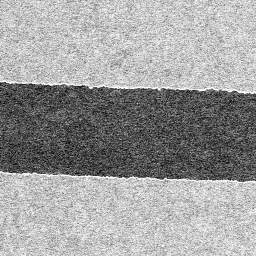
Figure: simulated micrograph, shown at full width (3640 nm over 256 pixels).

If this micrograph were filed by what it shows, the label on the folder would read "one or a few lines or trenches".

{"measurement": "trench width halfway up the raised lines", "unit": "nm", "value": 1280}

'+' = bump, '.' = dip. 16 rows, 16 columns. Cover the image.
++++++++++++++++
++++++++++++++++
++++++++++++++++
++++++++++++++++
++++++++++++++++
.......+++++++++
................
................
................
................
................
++++++++++++++++
++++++++++++++++
++++++++++++++++
++++++++++++++++
++++++++++++++++